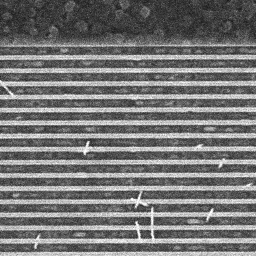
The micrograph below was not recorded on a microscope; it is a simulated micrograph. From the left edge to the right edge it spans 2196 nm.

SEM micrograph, parallel lines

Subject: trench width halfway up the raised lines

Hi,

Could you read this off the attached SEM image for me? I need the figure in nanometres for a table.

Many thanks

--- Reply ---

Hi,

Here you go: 79.4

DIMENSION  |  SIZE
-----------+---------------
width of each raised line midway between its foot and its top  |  32.2 nm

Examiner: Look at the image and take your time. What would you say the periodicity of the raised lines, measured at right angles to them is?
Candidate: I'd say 113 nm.